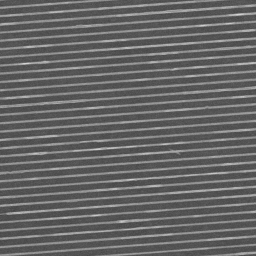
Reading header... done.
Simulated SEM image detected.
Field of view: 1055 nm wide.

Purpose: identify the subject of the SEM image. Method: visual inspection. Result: parallel lines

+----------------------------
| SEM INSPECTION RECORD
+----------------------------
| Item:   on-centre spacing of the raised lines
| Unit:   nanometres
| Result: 33.9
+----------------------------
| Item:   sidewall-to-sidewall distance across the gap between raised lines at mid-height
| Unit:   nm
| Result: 26.2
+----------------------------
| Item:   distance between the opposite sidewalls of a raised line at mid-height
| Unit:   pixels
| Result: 1.99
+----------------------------